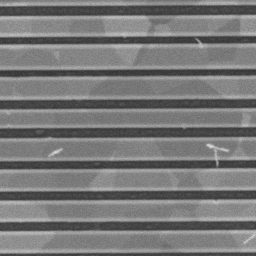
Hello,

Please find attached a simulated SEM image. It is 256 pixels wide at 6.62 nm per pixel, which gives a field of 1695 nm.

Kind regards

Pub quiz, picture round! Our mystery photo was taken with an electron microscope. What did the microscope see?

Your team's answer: parallel lines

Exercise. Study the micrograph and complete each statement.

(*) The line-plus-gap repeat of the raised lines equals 204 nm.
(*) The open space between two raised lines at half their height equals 77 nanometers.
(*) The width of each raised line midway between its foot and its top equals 128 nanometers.